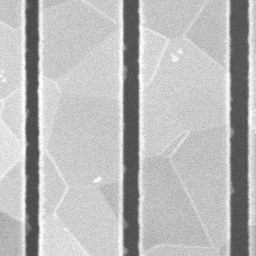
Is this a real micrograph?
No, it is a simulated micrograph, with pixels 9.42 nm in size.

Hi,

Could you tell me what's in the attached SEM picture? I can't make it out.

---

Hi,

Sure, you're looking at lines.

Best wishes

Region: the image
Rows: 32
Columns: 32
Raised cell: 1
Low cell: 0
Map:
11100111111111100111111111111001
11100111111111100111111111111001
11100111111111100111111111111001
11100111111111100111111111111001
11100111111111100111111111111001
11100111111111100111111111111001
11100111111111100111111111111001
11100111111111100111111111111001
11100111111111100111111111111001
11100111111111100111111111111001
11100111111111100111111111111001
11100111111111100111111111111001
11100111111111100111111111111001
11100111111111100111111111111001
11100111111111100111111111111001
11100111111111100111111111111001
11100111111111100111111111111001
11100111111111100111111111111001
11100111111111100111111111111001
11100111111111100111111111111001
11100111111111100111111111111001
11100111111111100111111111111001
11100111111111100111111111111001
11100111111111100111111111111001
11100111111111100111111111111001
11100111111111100111111111111001
11100111111111100111111111111001
11100111111111100111111111111001
11100111111111100111111111111001
11100111111111100111111111111001
11100111111111100111111111111001
11100111111111100111111111111001